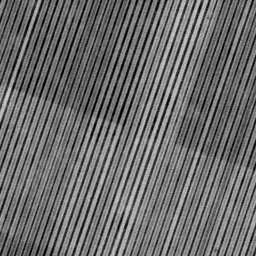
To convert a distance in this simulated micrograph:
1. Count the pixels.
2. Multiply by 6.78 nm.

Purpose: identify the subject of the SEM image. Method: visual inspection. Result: parallel lines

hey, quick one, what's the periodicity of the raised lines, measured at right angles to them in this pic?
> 0.0465 µm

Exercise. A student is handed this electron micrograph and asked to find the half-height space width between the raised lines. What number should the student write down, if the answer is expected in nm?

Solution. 16.8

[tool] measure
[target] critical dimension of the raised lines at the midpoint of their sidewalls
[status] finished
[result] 29.7 nanometers